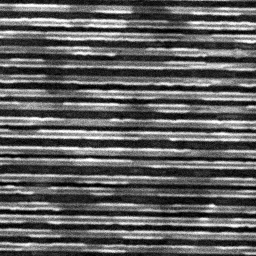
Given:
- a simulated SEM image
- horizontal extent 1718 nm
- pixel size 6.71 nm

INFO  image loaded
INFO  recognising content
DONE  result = parallel lines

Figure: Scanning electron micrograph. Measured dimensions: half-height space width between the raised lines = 41.1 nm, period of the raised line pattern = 94.3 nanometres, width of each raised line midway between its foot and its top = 0.0512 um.